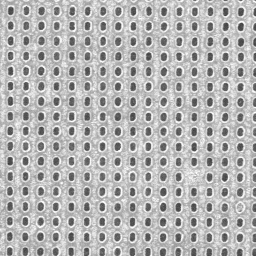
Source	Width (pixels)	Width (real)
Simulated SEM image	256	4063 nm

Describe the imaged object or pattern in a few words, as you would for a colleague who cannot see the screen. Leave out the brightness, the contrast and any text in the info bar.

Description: a regular array of holes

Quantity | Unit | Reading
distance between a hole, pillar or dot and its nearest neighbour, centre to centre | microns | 0.233